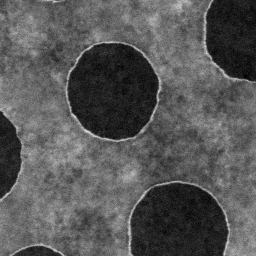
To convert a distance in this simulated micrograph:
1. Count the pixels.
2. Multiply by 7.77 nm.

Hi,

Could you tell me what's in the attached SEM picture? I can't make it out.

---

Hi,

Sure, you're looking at raised bodies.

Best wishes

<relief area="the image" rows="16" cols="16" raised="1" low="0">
0000000000000111
0000000000000111
0000000000000111
0000011110000111
0000111111000011
0000111111000000
0000111111000000
1000011110000000
1000001100000000
1000000000000000
1000000000000000
1000000000110000
0000000001111100
0000000011111100
0000000011111100
0010000011111100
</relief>